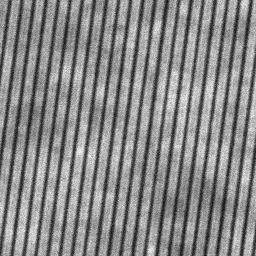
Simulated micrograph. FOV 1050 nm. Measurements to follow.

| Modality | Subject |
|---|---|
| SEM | parallel lines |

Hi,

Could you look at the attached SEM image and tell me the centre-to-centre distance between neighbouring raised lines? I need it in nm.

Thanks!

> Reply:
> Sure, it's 49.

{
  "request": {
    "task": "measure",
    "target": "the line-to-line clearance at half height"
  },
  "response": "0.0198 µm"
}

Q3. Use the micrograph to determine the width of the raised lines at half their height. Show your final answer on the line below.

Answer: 27.4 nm